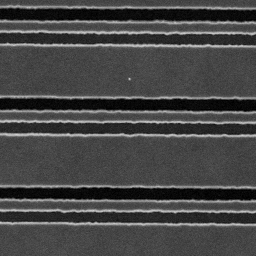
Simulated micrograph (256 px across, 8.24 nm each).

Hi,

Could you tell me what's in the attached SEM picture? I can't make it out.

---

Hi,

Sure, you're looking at lines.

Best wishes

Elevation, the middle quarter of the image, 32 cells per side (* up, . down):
********************************
********************************
********************************
********************************
********************************
********************************
********************************
********************************
**..*....****..**..********..***
................................
................................
................................
********************************
********************************
********************************
................................
................................
*****.***.**.**..****......*....
********************************
********************************
********************************
********************************
********************************
********************************
********************************
********************************
********************************
********************************
********************************
********************************
********************************
................................